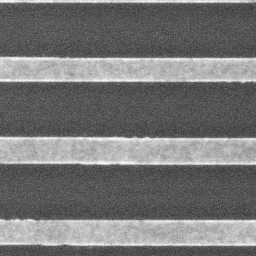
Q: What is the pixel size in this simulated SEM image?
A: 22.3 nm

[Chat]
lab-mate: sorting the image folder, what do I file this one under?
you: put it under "lines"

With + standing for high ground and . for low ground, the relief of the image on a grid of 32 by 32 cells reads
................................
................................
................................
................................
................................
................................
................................
++++++++++++++++++++++++++++++++
++++++++++++++++++++++++++++++++
++++++++++++++++++++++++++++++++
................................
................................
................................
................................
................................
................................
................................
++++++++++++++++++++++++++++++++
++++++++++++++++++++++++++++++++
++++++++++++++++++++++++++++++++
................................
................................
................................
................................
................................
................................
................................
................................
++++++++++++++++++++++++++++++++
++++++++++++++++++++++++++++++++
.............+.....+++++++++++++
................................